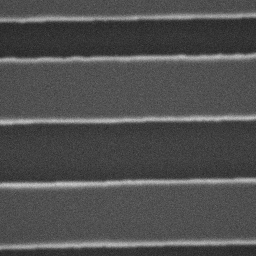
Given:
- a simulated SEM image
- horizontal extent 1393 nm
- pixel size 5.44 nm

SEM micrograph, lines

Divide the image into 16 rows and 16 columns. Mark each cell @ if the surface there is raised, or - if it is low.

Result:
@@@@@@@@@@@@@@@@
----------------
----------------
-----------@-@@@
@@@@@@@@@@@@@@@@
@@@@@@@@@@@@@@@@
@@@@@@@@@@@@@@@@
@@@@@@@@@@@@@@--
----------------
----------------
----------------
-@@@@@@@@@@@@@@@
@@@@@@@@@@@@@@@@
@@@@@@@@@@@@@@@@
@@@@@@@@@@@@@@@@
@@--------------